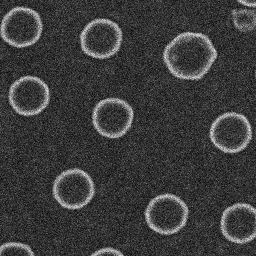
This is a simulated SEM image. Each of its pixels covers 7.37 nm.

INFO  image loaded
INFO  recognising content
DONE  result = a regular array of raised bodies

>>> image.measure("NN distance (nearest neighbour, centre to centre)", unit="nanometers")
595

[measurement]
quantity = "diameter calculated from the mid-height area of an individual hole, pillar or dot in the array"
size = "38.1 px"